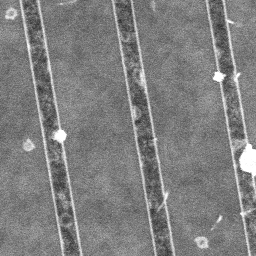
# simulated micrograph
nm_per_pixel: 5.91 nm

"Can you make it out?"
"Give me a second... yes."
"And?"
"one or a few lines or trenches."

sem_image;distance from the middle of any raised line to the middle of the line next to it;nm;538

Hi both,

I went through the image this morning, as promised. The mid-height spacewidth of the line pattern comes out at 434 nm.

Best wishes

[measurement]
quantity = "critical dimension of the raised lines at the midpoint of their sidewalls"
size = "18.4 px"